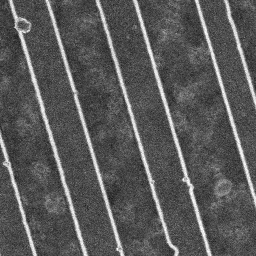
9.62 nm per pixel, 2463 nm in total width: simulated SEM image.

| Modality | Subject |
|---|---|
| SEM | one or a few lines or trenches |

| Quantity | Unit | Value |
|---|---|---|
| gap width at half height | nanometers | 470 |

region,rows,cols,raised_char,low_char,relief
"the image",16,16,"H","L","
LHHLLLHHHLLLHHLL
LHHLLLLHHLLLLHHL
LHHHLLLHHLLLLHHL
LLHHLLLHHLLLLHHL
LLHHLLLHHHLLLLHL
LLHHHLLLHHLLLLHH
LLLHHLLLHHLLLLHH
LLLHHLLLHHHLLLHH
LLLHHLLLLHHLLLLH
LLLHHHLLLHHLLLLH
HLLLHHLLLHHHLLLH
HLLLHHLLLHHHLLLL
HLLLHHHLLLHHLLLL
HLLLLHHLLLHHLLLL
HHLLLHHLLLHHHLLL
HHLLLHHHLLLHHLLL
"